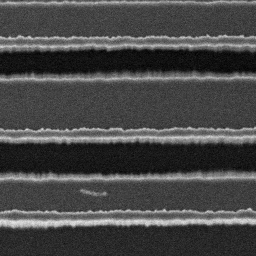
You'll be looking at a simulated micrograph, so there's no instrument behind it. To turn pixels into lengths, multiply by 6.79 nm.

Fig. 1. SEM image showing lines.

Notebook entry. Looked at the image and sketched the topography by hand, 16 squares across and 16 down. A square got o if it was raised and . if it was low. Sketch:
oooooooooooooooo
oooooooooooooooo
oooooooooooooooo
................
................
oooooooooooooooo
oooooooooooooooo
oooooooooooooooo
oooooooooooooooo
................
................
oooooooooooooooo
oooooooooooooooo
oooooooooooooooo
................
................